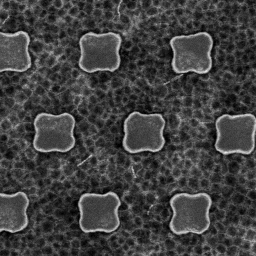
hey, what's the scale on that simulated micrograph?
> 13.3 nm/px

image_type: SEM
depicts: raised bodies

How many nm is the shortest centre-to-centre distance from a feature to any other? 1220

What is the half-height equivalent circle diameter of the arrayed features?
562 nm